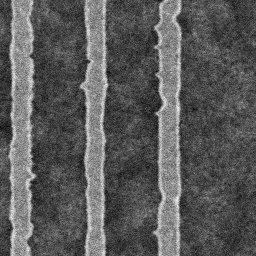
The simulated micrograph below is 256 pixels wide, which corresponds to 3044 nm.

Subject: one or a few lines or trenches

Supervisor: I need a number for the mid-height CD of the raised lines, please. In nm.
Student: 204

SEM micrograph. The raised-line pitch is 880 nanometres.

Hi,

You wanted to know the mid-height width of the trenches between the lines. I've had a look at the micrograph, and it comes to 679 nm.